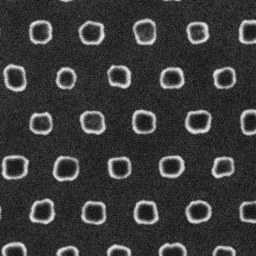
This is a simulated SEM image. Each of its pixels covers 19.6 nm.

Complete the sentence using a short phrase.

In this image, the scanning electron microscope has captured a regular array of raised bodies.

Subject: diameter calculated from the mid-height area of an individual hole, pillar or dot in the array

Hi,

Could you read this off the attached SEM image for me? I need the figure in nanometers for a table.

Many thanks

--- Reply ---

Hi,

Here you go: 447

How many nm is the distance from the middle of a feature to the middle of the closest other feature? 995